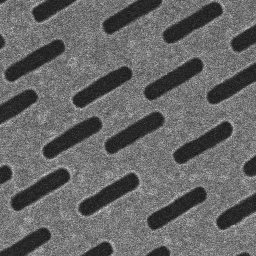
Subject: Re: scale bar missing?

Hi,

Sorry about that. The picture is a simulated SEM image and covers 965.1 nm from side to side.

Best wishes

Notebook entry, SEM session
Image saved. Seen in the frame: a regular array of holes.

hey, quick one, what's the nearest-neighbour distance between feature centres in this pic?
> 227 nm